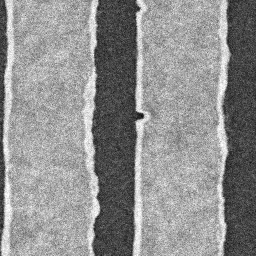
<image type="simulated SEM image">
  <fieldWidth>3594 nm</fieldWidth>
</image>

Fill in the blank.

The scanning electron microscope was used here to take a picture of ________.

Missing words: one or a few lines or trenches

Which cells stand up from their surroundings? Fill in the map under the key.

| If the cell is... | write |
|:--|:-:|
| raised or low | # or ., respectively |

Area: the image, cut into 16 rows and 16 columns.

.#####...#####..
.#####...#####..
.#####...#####..
.#####...#####..
.#####...#####..
.#####...#####..
.#####...#####..
######...#####..
######...#####..
######...#####..
######...#####..
######...#####..
######...#####..
.#####...#####..
######...#####..
######...#####..